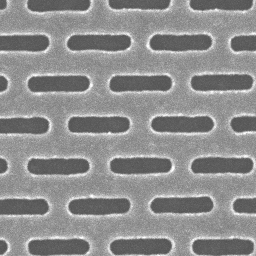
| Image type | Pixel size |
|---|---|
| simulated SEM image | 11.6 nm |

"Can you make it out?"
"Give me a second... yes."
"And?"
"a regular array of holes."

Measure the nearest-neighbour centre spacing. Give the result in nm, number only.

664